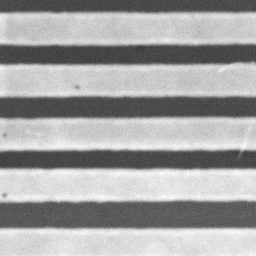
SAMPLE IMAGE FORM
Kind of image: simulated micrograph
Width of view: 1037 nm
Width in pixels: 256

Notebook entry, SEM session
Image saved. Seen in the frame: lines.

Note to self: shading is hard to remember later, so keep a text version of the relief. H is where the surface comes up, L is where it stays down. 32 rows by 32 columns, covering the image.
LLLLLLLLLLLLLLLLLLLLLLLLLLLLLLLL
LLLLLLLLLLLLLLLLLLLLLLLLLLLLLLLL
HHHHHHHHHHHHHHHHHHHHHHHHHHHHHHHH
HHHHHHHHHHHHHHHHHHHHHHHHHHHHHHHH
HHHHHHHHHHHHHHHHHHHHHHHHHHHHHHHH
HHHHHHHHHHHHHHHHHHHHHHHHHHHHHLLH
LLLLLLLLLLLLLLLLLLLLLLLLLLLLLLLL
LLLLLLLLLLLLLLLLLLLLLLLLLLLLLLLL
HHHHHHHHHHHHHHHHHHHHHHHHHHHHHHHH
HHHHHHHHHHHHHHHHHHHHHHHHHHHHHHHH
HHHHHHHHHHHHHHHHHHHHHHHHHHHHHHHH
HHHHHHHHHHHHHHHHHHHHHHHHHHHHHHHH
LLLLLLLLLLLLLLLLLLLLLLLLLLLLLLLL
LLLLLLLLLLLLLLLLLLLLLLLLLLLLLLLL
LLLLLLLLLLLLLLLLLLLLLLLLLLLLLLLL
HHHHHHHHHHHHHHHHHHHHHHHHHHHHHHHH
HHHHHHHHHHHHHHHHHHHHHHHHHHHHHHHH
HHHHHHHHHHHHHHHHHHHHHHHHHHHHHHHH
HHHHHHHHHHHHHHHHHHHHHHHHHHHHHHHH
LLLLLLLLLLLLLLLLLLLLLLLLLLLLLLLL
LLLLLLLLLLLLLLLLLLLLLLLLLLLLLLLL
HHHHHHHHHHHHHHHHHHHHHHHHHHHHHHHH
HHHHHHHHHHHHHHHHHHHHHHHHHHHHHHHH
HHHHHHHHHHHHHHHHHHHHHHHHHHHHHHHH
HHHHHHHHHHHHHHHHHHHHHHHHHHHHHHHH
LLLLLLLLLLLLLLLLLLLLLLLLLLLLLLLL
LLLLLLLLLLLLLLLLLLLLLLLLLLLLLLLL
LLLLLLLLLLLLLLLLLLLLLLLLLLLLLLLL
LLLLLLLLLLLLLLLLLLLLLLLLLLLLLLLL
HHHHHHHHHHHHHHHHHHHHHHHHHHHHHHHH
HHHHHHHHHHHHHHHHHHHHHHHHHHHHHHHH
HHHHHHHHHHHHHHHHHHHHHHHHHHHHHHHH